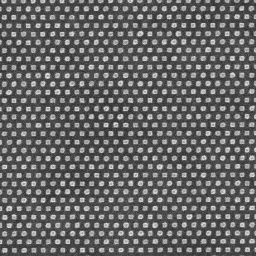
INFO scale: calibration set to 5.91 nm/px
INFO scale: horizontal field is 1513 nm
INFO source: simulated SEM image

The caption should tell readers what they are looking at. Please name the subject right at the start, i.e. a regular array of raised bodies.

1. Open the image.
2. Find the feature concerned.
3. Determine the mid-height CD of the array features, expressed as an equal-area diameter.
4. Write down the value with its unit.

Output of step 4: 28.3 nm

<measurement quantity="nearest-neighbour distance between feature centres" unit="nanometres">54.2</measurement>